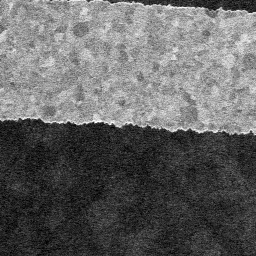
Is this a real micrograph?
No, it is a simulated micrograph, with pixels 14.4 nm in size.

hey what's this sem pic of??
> one or a few lines or trenches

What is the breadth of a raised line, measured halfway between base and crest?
1750 nm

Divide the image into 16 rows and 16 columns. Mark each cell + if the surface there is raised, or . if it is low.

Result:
++++++++++++....
++++++++++++++++
++++++++++++++++
++++++++++++++++
++++++++++++++++
++++++++++++++++
++++++++++++++++
...+++++++++++++
................
................
................
................
................
................
................
................